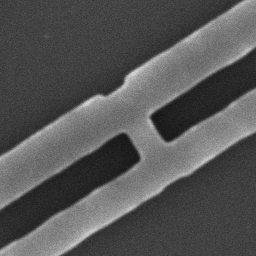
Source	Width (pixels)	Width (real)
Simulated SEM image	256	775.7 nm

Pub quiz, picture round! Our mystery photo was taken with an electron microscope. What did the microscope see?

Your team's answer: groups of lines, slits or small figures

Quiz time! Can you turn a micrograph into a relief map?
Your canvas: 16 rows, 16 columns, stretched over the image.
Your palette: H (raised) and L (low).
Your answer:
LLLLLLLLLLLLLLLH
LLLLLLLLLLLLLHHH
LLLLLLLLLLLHHHHH
LLLLLLLLLLHHHHHL
LLLLLLLLHHHHHLLL
LLLLLLLHHHHHLLLL
LLLLLHHHHHLLLLHH
LLLLHHHHHLLLLHHH
LLHHHHHLHHLHHHHL
LHHHHHLLLHHHHHLL
HHHHLLLLHHHHLLLL
HHLLLLLHHHHLLLLL
HLLLLHHHHLLLLLLL
LLLHHHHHLLLLLLLL
LLHHHHLLLLLLLLLL
HHHHLLLLLLLLLLLL